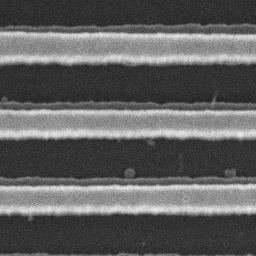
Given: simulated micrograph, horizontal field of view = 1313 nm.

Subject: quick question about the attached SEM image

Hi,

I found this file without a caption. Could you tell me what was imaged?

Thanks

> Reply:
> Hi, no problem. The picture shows lines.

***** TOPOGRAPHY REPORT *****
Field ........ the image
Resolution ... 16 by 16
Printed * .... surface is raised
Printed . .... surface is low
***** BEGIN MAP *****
................
................
****************
****************
................
................
****************
****************
****************
................
................
****************
****************
................
................
................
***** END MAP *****